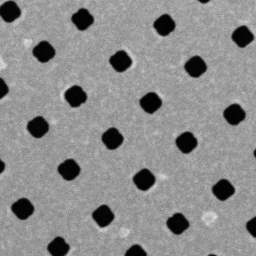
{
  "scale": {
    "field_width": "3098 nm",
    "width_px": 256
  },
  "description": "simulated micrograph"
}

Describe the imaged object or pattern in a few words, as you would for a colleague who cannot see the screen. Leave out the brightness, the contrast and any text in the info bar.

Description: a regular array of holes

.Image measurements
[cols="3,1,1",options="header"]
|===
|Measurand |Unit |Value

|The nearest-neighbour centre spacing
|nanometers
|629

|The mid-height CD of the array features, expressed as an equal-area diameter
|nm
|258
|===